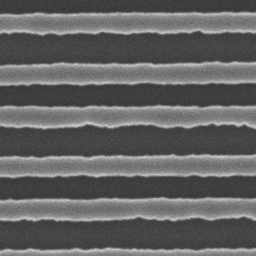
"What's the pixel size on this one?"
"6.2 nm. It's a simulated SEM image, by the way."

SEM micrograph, lines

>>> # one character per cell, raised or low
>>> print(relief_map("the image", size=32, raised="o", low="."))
................................
................................
oooooooooooooooooooooooooooooooo
oooooooooooooooooooooooooooooooo
................................
................................
................................
................................
oooooooooooooooooooooooooooooooo
oooooooooooooooooooooooooooooooo
oooo.oooooooo...o...ooo..o......
................................
................................
oooooooooooooooooooooooooooooooo
oooooooooooooooooooooooooooooooo
oooooooooooooooooooooooooo.ooooo
................................
................................
................................
............o.oo..oooo.ooooooooo
oooooooooooooooooooooooooooooooo
oooooooooooooooooooooooooooooooo
................................
................................
................................
oooooooooooooooooooooooooooooooo
oooooooooooooooooooooooooooooooo
oo..o..oooooo...................
................................
................................
................................
oooooooooooooooooooooooooooooooo